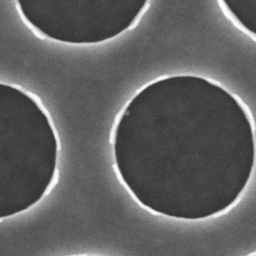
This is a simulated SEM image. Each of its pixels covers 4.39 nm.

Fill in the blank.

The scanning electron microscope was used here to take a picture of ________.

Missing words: holes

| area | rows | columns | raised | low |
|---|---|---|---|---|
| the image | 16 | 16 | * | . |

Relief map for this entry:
*........*****..
**......*******.
****..**********
****************
****************
.********.....**
..******.......*
...****.........
...****.........
....***.........
...****.........
...*****.......*
..*******......*
***********..***
****************
****************